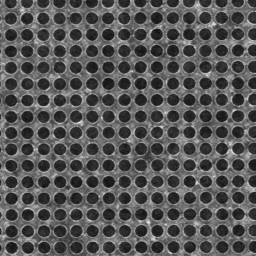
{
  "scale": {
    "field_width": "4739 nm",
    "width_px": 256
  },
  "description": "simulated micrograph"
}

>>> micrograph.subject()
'a regular array of holes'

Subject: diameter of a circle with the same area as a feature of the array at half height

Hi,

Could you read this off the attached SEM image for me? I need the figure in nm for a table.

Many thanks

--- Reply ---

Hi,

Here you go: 234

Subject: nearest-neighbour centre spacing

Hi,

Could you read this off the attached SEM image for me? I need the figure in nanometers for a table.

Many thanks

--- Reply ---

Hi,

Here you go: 298